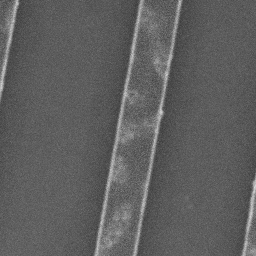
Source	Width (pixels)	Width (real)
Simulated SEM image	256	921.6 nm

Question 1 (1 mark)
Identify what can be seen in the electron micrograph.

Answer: one or a few lines or trenches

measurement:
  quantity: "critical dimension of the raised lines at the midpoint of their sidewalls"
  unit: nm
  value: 141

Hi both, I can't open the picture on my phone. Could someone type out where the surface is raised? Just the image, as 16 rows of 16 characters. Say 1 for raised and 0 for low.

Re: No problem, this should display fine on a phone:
1000000001100000
1000000001100000
1000000011100000
0000000011100000
0000000011100000
0000000011000000
0000000011000000
0000000111000000
0000000111000000
0000000111000000
0000000110000000
0000000110000000
0000000110000000
0000001110000000
0000001110000001
0000001110000001